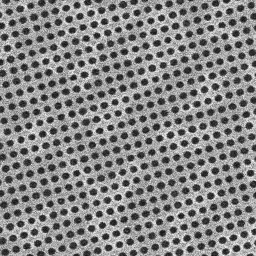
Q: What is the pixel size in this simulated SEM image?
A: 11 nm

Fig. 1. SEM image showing a regular array of holes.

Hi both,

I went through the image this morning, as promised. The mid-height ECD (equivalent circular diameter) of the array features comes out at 85.2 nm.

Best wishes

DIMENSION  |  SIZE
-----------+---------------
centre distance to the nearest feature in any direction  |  0.122 µm